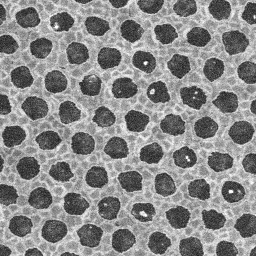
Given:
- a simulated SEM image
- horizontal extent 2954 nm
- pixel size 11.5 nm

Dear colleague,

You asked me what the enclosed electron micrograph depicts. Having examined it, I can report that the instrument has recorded a regular array of holes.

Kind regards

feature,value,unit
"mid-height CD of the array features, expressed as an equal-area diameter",270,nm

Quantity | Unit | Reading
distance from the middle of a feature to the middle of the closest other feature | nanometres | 383